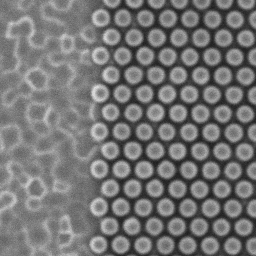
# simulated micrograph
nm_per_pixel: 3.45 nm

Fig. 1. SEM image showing a regular array of raised bodies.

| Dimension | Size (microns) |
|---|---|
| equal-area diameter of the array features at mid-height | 0.0574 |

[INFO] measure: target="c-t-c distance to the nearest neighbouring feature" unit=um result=0.0748